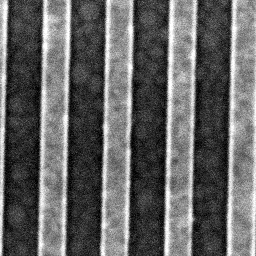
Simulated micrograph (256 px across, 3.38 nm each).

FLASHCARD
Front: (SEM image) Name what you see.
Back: one or a few lines or trenches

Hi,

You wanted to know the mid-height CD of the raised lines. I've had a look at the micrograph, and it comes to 83.3 nanometers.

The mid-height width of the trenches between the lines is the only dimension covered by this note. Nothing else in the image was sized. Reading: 130 nanometres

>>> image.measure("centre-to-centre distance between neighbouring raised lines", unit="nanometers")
214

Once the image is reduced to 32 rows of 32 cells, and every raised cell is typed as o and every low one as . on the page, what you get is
o.....ooo....ooo.....ooo.....ooo
o.....ooo....ooo.....ooo.....ooo
o.....ooo....ooo.....ooo.....ooo
o.....oo.....ooo.....ooo.....ooo
o....ooo.....ooo.....ooo.....ooo
o....ooo.....ooo.....ooo.....ooo
o....ooo.....ooo.....ooo.....ooo
o....ooo.....ooo.....ooo.....ooo
.....ooo.....ooo.....ooo.....ooo
.....ooo.....ooo.....ooo.....ooo
.....ooo.....ooo.....ooo.....ooo
.....ooo.....ooo.....ooo.....ooo
.....ooo.....ooo.....ooo.....ooo
.....ooo.....ooo.....ooo.....ooo
.....ooo.....ooo.....ooo.....ooo
.....ooo.....ooo.....ooo.....ooo
.....ooo.....ooo.....ooo.....ooo
.....ooo.....ooo.....ooo.....ooo
.....ooo.....ooo.....ooo.....ooo
.....ooo.....ooo.....ooo.....ooo
.....ooo.....ooo.....ooo.....ooo
.....ooo.....ooo.....ooo.....ooo
.....ooo.....ooo.....ooo.....ooo
.....ooo.....ooo.....ooo.....ooo
.....ooo.....ooo.....ooo.....ooo
.....ooo.....ooo.....ooo.....ooo
.....ooo.....ooo.....ooo.....ooo
.....ooo.....ooo.....ooo.....ooo
.....ooo.....ooo.....ooo.....ooo
.....ooo.....ooo.....ooo.....ooo
.....ooo.....ooo.....ooo.....ooo
.....ooo.....ooo.....ooo.....ooo